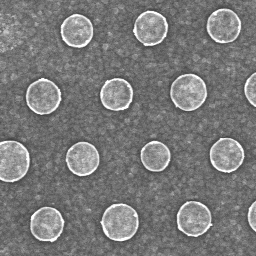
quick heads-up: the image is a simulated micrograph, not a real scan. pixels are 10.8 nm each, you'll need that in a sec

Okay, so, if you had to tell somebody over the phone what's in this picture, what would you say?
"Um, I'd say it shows a regular array of raised bodies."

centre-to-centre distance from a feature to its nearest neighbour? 789 nm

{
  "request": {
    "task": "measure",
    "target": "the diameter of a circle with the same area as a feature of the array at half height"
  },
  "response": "366 nm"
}